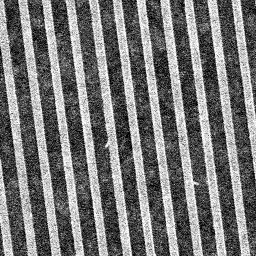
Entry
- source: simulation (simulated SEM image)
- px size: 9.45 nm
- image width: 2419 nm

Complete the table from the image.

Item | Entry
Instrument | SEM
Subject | parallel lines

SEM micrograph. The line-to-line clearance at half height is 145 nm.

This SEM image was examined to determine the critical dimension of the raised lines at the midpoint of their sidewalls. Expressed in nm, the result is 72.7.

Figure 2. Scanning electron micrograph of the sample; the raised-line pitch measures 222 nm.